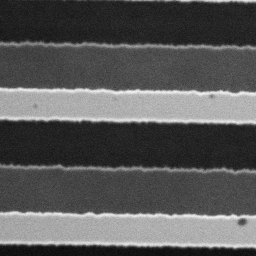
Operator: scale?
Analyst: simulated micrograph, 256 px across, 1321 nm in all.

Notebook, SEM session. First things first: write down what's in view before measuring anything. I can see lines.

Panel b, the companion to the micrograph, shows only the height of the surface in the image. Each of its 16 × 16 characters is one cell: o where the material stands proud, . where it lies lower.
................
................
................
oooooooooooooooo
oooooooooooooooo
oooooooooooooooo
oooooooooooooooo
....oooooooooooo
................
................
oooooo..........
oooooooooooooooo
oooooooooooooooo
oooooooooooooooo
oooooooooooooooo
................